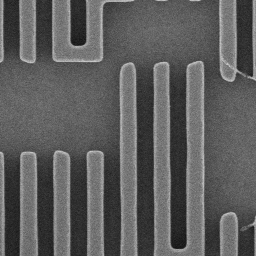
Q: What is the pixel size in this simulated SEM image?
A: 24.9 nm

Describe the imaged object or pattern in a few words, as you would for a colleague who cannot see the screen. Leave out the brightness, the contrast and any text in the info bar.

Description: wiring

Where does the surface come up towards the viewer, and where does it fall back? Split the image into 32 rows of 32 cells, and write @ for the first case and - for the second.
--@@---@@--@@---------------@@--
--@@---@@--@@---------------@@--
---@---@@--@@---------------@@--
---@---@@--@@---------------@@--
---@---@@--@@---------------@@--
---@---@@-@@@---------------@@--
---@---@@@@@@---------------@@--
---@---@@@@@@---------------@@--
---------------@@--@@--@@---@@--
---------------@@--@@--@@---@---
---------------@@--@@--@@-------
---------------@@--@@--@@-------
---------------@@--@@--@@-------
---------------@@--@@--@@-------
---------------@@--@@--@@-------
---------------@@--@@--@@-------
---------------@@--@@--@@-------
---------------@@--@@--@@-------
---------------@@--@@--@@-------
---@@--@@--@@--@@--@@--@@-------
---@@--@@--@@--@@--@@--@@-------
---@@--@@--@@--@@--@@--@@@------
---@@--@@--@@--@@--@@--@@@------
---@@--@@--@@--@@--@@--@@-------
---@@--@@--@@--@@--@@--@@-------
@--@@--@@--@@--@@--@@--@@-------
@--@@--@@--@@--@@--@@--@@-------
@--@@--@@--@@--@@--@@--@@@--@@--
@--@@--@@--@@--@@--@@--@@@--@@--
@--@@--@@--@@--@@--@@--@@@--@@--
@--@@--@@--@@--@@--@@--@@@--@@--
@--@@--@@--@@--@@--@@@@@@@--@@--